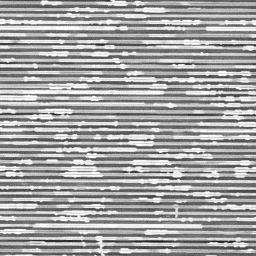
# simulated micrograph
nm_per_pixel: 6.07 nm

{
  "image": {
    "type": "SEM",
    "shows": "parallel lines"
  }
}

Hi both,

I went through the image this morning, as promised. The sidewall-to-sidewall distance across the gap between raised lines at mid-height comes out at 22.8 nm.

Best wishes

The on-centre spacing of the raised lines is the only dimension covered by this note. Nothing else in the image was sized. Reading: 38.5 nanometres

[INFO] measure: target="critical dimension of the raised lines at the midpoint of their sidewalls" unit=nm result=17.5